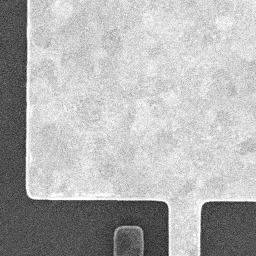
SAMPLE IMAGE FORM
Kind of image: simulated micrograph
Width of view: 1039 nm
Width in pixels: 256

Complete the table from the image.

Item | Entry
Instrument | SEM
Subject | wiring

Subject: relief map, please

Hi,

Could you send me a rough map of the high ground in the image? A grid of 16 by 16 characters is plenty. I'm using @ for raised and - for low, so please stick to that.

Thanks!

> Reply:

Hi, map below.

--@@@@@@@@@@@@@@
--@@@@@@@@@@@@@@
--@@@@@@@@@@@@@@
--@@@@@@@@@@@@@@
--@@@@@@@@@@@@@@
--@@@@@@@@@@@@@@
--@@@@@@@@@@@@@@
--@@@@@@@@@@@@@@
--@@@@@@@@@@@@@@
--@@@@@@@@@@@@@@
--@@@@@@@@@@@@@@
--@@@@@@@@@@@@@@
----------@@@@@@
-----------@@---
-------@@--@----
-------@@--@----